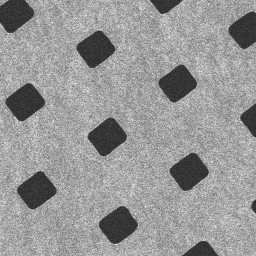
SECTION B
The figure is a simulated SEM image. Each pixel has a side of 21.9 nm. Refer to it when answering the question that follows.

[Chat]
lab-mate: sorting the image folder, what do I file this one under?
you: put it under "holes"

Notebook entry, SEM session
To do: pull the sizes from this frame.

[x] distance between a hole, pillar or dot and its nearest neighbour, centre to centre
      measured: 1940 nm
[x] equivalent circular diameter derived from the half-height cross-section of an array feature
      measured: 0.761 um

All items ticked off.